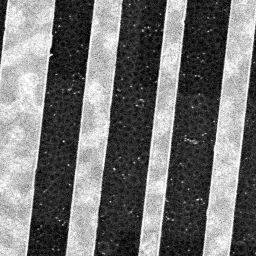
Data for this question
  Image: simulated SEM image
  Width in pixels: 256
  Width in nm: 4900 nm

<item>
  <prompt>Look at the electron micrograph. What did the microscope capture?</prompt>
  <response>one or a few lines or trenches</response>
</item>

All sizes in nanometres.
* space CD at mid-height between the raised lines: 875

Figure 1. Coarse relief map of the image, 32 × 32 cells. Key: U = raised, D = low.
DUUUUUUDDDDDUUUDDDDDDUUDDDDDDUUU
DUUUUUUDDDDDUUUDDDDDDUUDDDDDDUUU
DUUUUUUDDDDDUUUDDDDDDUUDDDDDDUUU
DUUUUUDDDDDDUUUDDDDDDUUDDDDDDUUU
DUUUUUDDDDDUUUUDDDDDUUUDDDDDDUUU
UUUUUUDDDDDUUUUDDDDDUUUDDDDDUUUU
UUUUUUDDDDDUUUUDDDDDUUUDDDDDUUUD
UUUUUUDDDDDUUUDDDDDDUUDDDDDDUUUD
UUUUUUDDDDDUUUDDDDDDUUDDDDDDUUUD
UUUUUUDDDDDUUUDDDDDDUUDDDDDDUUUD
UUUUUUDDDDDUUUDDDDDDUUDDDDDDUUUD
UUUUUUDDDDDUUUDDDDDDUUDDDDDDUUUD
UUUUUDDDDDDUUUDDDDDDUUDDDDDDUUUD
UUUUUDDDDDUUUUDDDDDUUUDDDDDDUUUD
UUUUUDDDDDUUUUDDDDDUUUDDDDDUUUUD
UUUUUDDDDDUUUUDDDDDUUUDDDDDUUUDD
UUUUUDDDDDUUUDDDDDDUUDDDDDDUUUDD
UUUUUDDDDDUUUDDDDDDUUDDDDDDUUUDD
UUUUUDDDDDUUUDDDDDDUUDDDDDDUUUDD
UUUUUDDDDDUUUDDDDDDUUDDDDDDUUUDD
UUUUUDDDDDUUUDDDDDDUUDDDDDDUUUDD
UUUUDDDDDDUUUDDDDDDUUDDDDDDUUUDD
UUUUDDDDDUUUUDDDDDUUUDDDDDDUUUDD
UUUUDDDDDUUUUDDDDDUUUDDDDDUUUUDD
UUUUDDDDDUUUDDDDDDUUUDDDDDUUUDDD
UUUUDDDDDUUUDDDDDDUUDDDDDDUUUDDD
UUUUDDDDDUUUUDDDDDUUDDDDDDUUUDDD
UUUUDDDDDUUUDDDDDDUUDDDDDDUUUDDD
UUUUDDDDDUUUDDDDDDUUDDDDDDUUUDDD
UUUDDDDDDUUUDDDDDDUUDDDDDDUUUDDD
UUUDDDDDUUUUDDDDDDUUDDDDDDUUUDDD
UUUDDDDDUUUUDDDDDUUUDDDDDUUUUDDD